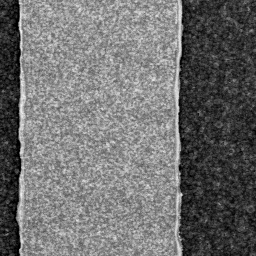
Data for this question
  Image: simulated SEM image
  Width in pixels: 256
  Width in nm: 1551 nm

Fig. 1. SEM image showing one or a few lines or trenches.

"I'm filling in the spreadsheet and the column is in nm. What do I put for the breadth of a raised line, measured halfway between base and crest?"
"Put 955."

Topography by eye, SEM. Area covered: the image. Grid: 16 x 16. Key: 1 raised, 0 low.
0111111111100000
0111111111100000
0111111111100000
0111111111100000
0111111111100000
0111111111100000
0111111111100000
0111111111100000
0111111111100000
0111111111100000
0111111111100000
0111111111100000
0111111111100000
0111111111100000
0111111111100000
0111111111100000